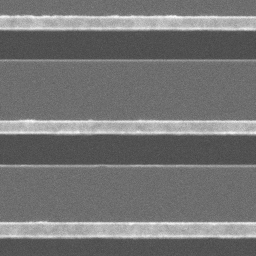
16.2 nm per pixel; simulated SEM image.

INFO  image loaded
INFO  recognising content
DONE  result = lines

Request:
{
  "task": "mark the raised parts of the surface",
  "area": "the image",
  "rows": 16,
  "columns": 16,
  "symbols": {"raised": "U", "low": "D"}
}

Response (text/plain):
UUUUUUUUUUUUUUUU
UUUUUUUUUUUUUUUU
DDDDDDDDDDDDDDDD
DDDDDDDDDDDDDDDD
UUUUUUUUUUUUUUUU
UUUUUUUUUUUUUUUU
UUUUUUUUUUUUUUUU
UUUUUUUUUUUUUUUU
DDDDDDDDDDDDDDDD
DDDDDDDDDDDDDDDD
UUUUUUUUUUUUUUUU
UUUUUUUUUUUUUUUU
UUUUUUUUUUUUUUUU
UUUUUUUUUUUUUUUU
UUUUUUUUUUUUUUUU
DDDDDDDDDDDDDDDD